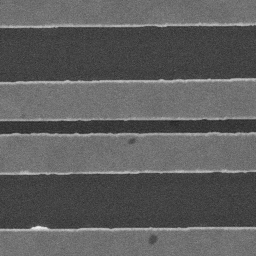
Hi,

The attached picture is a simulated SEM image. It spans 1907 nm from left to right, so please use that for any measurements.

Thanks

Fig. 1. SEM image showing lines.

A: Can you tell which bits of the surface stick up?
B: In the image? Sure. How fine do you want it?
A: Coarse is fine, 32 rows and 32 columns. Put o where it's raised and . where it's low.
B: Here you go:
oooooooooooooooooooooooooooooooo
oooooooooooooooooooooooooooooooo
oooooooooooooooooooooooooooooooo
................................
................................
................................
................................
................................
................................
................................
oooooooooooooooooooooooooooooooo
oooooooooooooooooooooooooooooooo
oooooooooooooooooooooooooooooooo
oooooooooooooooooooooooooooooooo
oooooooooooooooooooooooooooooooo
................................
................................
oooooooooooooooooooooooooooooooo
oooooooooooooooooooooooooooooooo
oooooooooooooooooooooooooooooooo
oooooooooooooooooooooooooooooooo
ooooooooooooooooooooooooooooooo.
................................
................................
................................
................................
................................
................................
.......................ooooooooo
oooooooooooooooooooooooooooooooo
oooooooooooooooooooooooooooooooo
oooooooooooooooooooooooooooooooo